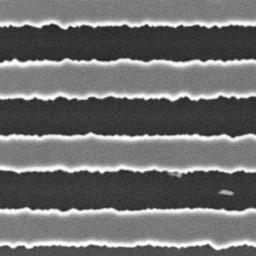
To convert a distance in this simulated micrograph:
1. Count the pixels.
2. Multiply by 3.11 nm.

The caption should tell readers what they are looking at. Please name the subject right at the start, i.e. lines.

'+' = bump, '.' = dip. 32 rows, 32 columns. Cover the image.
++++++++++++++++++++++++++++++++
++++++++++++++++++++++++++++++++
++++++++++++++++++++++++++++++++
................................
................................
................................
................................
........+..+...++..++...+.....++
++++++++++++++++++++++++++++++++
++++++++++++++++++++++++++++++++
++++++++++++++++++++++++++++++++
++++++++++++++++++++++++++++++++
.....................+..........
................................
................................
................................
................................
++++++++++++++++++++++++++++++++
++++++++++++++++++++++++++++++++
++++++++++++++++++++++++++++++++
++++++++++++++++++++++++++++++++
..+.....+...+.........++....+..+
................................
................................
................................
................................
++++++++++++++++++++++++++++++++
++++++++++++++++++++++++++++++++
++++++++++++++++++++++++++++++++
++++++++++++++++++++++++++++++++
++++++++++++++++++++++++++++++++
................................